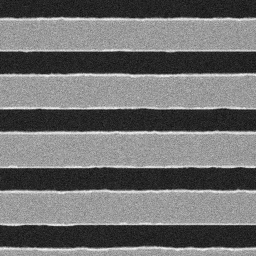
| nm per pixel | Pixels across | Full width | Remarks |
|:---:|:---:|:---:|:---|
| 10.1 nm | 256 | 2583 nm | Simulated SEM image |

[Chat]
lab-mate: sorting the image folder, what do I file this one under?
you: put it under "lines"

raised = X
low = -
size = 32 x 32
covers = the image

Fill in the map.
--------------------------------
--------------------------------
XXXXXXXXXXXXXXXXXXXXXXXXXXXXXXXX
XXXXXXXXXXXXXXXXXXXXXXXXXXXXXXXX
XXXXXXXXXXXXXXXXXXXXXXXXXXXXXXXX
XXXXXXXXXXXXXXXXXXXXXXXXXXXXXXXX
--------------------------------
--------------------------------
--------------------------------
XXXXXXXXXXXXXXXXXXXXXXXXXXXXXXXX
XXXXXXXXXXXXXXXXXXXXXXXXXXXXXXXX
XXXXXXXXXXXXXXXXXXXXXXXXXXXXXXXX
XXXXXXXXXXXXXXXXXXXXXXXXXXXXXXXX
XXXXXXXXXXXXXXXXXXXXXXXXXXXXXXXX
--------------------------------
--------------------------------
-------XX--XXXXXXXXX-XXX-XXXXXXX
XXXXXXXXXXXXXXXXXXXXXXXXXXXXXXXX
XXXXXXXXXXXXXXXXXXXXXXXXXXXXXXXX
XXXXXXXXXXXXXXXXXXXXXXXXXXXXXXXX
XXXXXXXXXXXXXXXXXXXXXXXXXXXXXXXX
--------------------------------
--------------------------------
--------------------------------
XXXXXXXXXXXXXXXXXXXXXXXXXXXXXXXX
XXXXXXXXXXXXXXXXXXXXXXXXXXXXXXXX
XXXXXXXXXXXXXXXXXXXXXXXXXXXXXXXX
XXXXXXXXXXXXXXXXXXXXXXXXXXXXXXXX
--------------------------------
--------------------------------
--------------------------------
XXXXXXXXXXXXXXXXXXXXXXXXXXXXXXXX